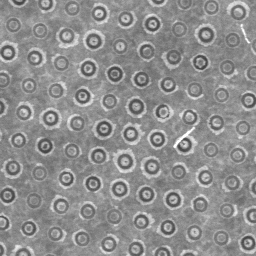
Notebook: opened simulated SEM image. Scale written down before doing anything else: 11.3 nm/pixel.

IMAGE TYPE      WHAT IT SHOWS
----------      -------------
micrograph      a regular array of ring-shaped grooves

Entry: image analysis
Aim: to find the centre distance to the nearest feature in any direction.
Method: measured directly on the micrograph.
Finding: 0.308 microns